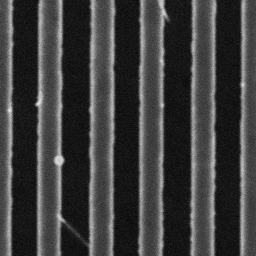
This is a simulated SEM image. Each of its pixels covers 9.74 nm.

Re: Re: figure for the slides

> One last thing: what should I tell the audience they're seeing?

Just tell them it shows lines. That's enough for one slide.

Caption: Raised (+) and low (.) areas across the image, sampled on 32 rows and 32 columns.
+....+++...+++....++....+++...++
+....+++...+++....+++...+++...++
+....+++...+++....++....+++...++
+....+++...+++....++....+++...++
+....+++...+++....++....+++...++
++...+++...+++....++....+++...++
+....+++...+++....++....+++...++
+....+++...+++....++....+++...++
+....+++...+++....++....+++...++
+....+++...+++....++....+++...++
+....+++...+++....++....+++...++
+....+++...+++....++....+++...++
+....+++...+++....++....+++...++
+....+++...+++....++....+++...++
+....+++...+++....++....+++...++
+....+++...+++....++....+++...++
+....+++...+++....++....+++...++
+....+++...+++....++....+++...++
+....+++...+++....++....+++...++
+....+++...+++....++....+++...++
+....+++...+++....++....+++...++
+....+++...+++....++....+++...++
+....+++...+++....++....+++...++
+....+++...+++....++....+++...++
+....+++...+++....++....+++...++
+....+++...+++....++....+++...++
+....+++...+++....++....+++...++
+....+++...+++....++....+++...++
+....++....+++....++....+++...++
+....++....+++...+++....+++...++
+....++....+++...+++....+++...++
+....+++...+++....++....+++...++